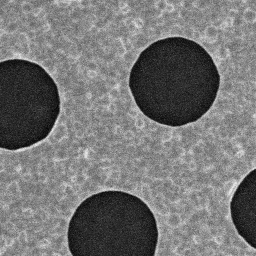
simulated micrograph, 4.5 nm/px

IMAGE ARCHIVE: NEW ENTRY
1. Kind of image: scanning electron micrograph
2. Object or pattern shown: holes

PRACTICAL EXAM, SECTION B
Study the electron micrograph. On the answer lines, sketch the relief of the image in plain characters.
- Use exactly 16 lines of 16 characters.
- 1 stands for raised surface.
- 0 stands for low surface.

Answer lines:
1111111111111111
1111111111111111
1111111111001111
1111111110000111
0001111100000011
0000111100000011
0000111110000111
0000111111001111
0001111111111111
1111111111111111
1111111111111111
1111111111111110
1111100001111100
1111100000111100
1111000000111110
1111000000111111